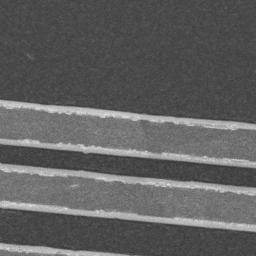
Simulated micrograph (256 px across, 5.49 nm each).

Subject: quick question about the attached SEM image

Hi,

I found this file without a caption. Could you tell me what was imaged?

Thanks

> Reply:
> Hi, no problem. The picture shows one or a few lines or trenches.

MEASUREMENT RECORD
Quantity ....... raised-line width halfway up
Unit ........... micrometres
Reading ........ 0.208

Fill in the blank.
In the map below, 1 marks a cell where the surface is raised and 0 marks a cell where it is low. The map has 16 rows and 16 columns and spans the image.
0000000000000000
0000000000000000
0000000000000000
0000000000000000
0000000000000000
0000000000000000
1000000000000000
1111111111100000
1111111111111111
0000000111111111
1000000000000000
1111111111100000
1111111111111111
0000000111111111
0000000000000000
1000000000000000